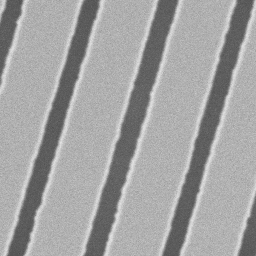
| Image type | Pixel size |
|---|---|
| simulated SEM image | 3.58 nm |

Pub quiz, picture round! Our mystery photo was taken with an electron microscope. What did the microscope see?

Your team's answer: lines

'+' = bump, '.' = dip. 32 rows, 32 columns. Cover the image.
+..+++++++..++++++++..+++++++...
...+++++++..+++++++...+++++++..+
..++++++++..+++++++...+++++++..+
..+++++++..++++++++..++++++++..+
..+++++++..+++++++...+++++++...+
.++++++++..+++++++...+++++++..++
.+++++++...+++++++..++++++++..++
.+++++++..++++++++..+++++++...++
.+++++++..+++++++...+++++++..+++
++++++++..+++++++...+++++++..+++
+++++++..++++++++..+++++++...+++
+++++++..+++++++...+++++++..++++
+++++++..+++++++...+++++++..++++
++++++...+++++++..++++++++..++++
++++++..+++++++...+++++++...++++
++++++..+++++++...+++++++..+++++
+++++...+++++++...+++++++..+++++
+++++..++++++++..+++++++...+++++
+++++..+++++++...+++++++..++++++
+++++..+++++++...+++++++..++++++
++++..++++++++..++++++++..++++++
++++..++++++++..+++++++..+++++++
++++..+++++++...+++++++..+++++++
+++...+++++++..++++++++..+++++++
+++..++++++++..+++++++...+++++++
+++..+++++++...+++++++..++++++++
++...+++++++...+++++++..+++++++.
++..++++++++..+++++++...+++++++.
++..+++++++...+++++++..++++++++.
++..+++++++...+++++++..+++++++..
+...+++++++..++++++++..+++++++..
+..++++++++..+++++++...+++++++..